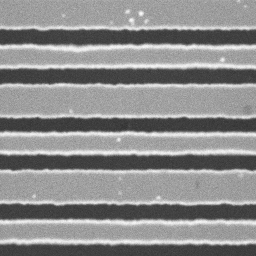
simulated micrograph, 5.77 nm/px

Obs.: lines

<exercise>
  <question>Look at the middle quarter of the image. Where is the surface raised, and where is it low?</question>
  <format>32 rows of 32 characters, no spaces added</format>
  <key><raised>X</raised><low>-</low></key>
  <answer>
XXXXXXXXXXXXXXXXXXXXXXXXXXXXXXXX
--------------------------------
--------------------------------
--------------------------------
--------------------------------
XXXXXXXXXXXXXXXXXXXXXXXXXXXXXXXX
XXXXXXXXXXXXXXXXXXXXXXXXXXXXXXXX
XXXXXXXXXXXXXXXXXXXXXXXXXXXXXXXX
XXXXXXXXXXXXXXXXXXXXXXXXXXXXXXXX
XXXXXXXXXXXXXXXXXXXXXXXXXXXXXXXX
XXXXXXXXXXXXXXXXXXXXXXXXXXXXXXXX
XXXXXXXXXXXXXXXXXXXXXXXXXXXXXXXX
XXXXXXXXXXXXXXXXXXXXXXXXXXXXXXXX
-----X-----X-------------------X
--------------------------------
--------------------------------
--------------------------------
XXXXXXXXXXXXXXXXXXXXXXXXXXXXXXXX
XXXXXXXXXXXXXXXXXXXXXXXXXXXXXXXX
XXXXXXXXXXXXXXXXXXXXXXXXXXXXXXXX
XXXXXXXXXXXXXXXXXXXXXXXXXXXXXXXX
XXXXXXXXXXXXXXXXXXXXXXXXXXXXXXXX
XXXXXXXXXXXXXXXXXXXXXXXXXXXXXXXX
--------------------------------
--------------------------------
--------------------------------
-X-X-----------------X--X-------
XXXXXXXXXXXXXXXXXXXXXXXXXXXXXXXX
XXXXXXXXXXXXXXXXXXXXXXXXXXXXXXXX
XXXXXXXXXXXXXXXXXXXXXXXXXXXXXXXX
XXXXXXXXXXXXXXXXXXXXXXXXXXXXXXXX
XXXXXXXXXXXXXXXXXXXXXXXXXXXXXXXX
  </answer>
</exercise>